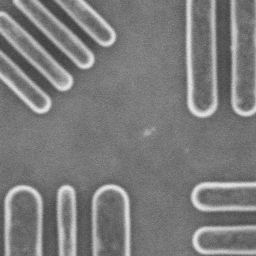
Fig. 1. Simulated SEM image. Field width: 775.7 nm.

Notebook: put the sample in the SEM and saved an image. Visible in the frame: groups of lines, slits or small figures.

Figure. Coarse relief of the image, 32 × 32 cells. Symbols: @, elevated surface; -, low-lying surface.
--@@@---@@@-------------@@@--@@@
---@@@---@@@------------@@@--@@@
@---@@@---@@@-----------@@@--@@@
@@---@@@--@@@@----------@@@--@@@
-@@@--@@@---@@----------@@@--@@@
--@@@--@@@---@----------@@@--@@@
---@@@--@@@-------------@@@--@@@
@---@@@--@@-------------@@@--@@@
@@---@@@----------------@@@--@@@
@@@---@@@---------------@@@--@@@
-@@@---@@---------------@@@--@@@
--@@@-------------------@@@--@@@
---@@@------------------@@@--@@@
----@@------------------@@@--@@@
--------------------------------
--------------------------------
--------------------------------
--------------------------------
--------------------------------
--------------------------------
--------------------------------
--------------------------------
--------------------------------
--@@----@----@@----------@@@@@@@
-@@@@--@@---@@@@--------@@@@@@@@
-@@@@--@@---@@@@--------@@@@@@@@
-@@@@--@@---@@@@----------------
-@@@@--@@---@@@@----------------
-@@@@--@@---@@@@-------------@@@
-@@@@---@---@@@@--------@@@@@@@@
-@@@@---@---@@@@--------@@@@@@@@
-@@@@---@---@@@@---------@@@@@@@